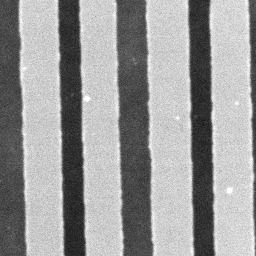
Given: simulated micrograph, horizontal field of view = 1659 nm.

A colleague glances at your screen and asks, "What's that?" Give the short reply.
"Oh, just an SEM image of lines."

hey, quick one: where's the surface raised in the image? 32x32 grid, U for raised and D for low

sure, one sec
DDDUUUUDDDUUUUDDDDUUUUUDDDUUUUUD
DDDUUUUDDDUUUUDDDDUUUUUDDDUUUUUD
DDDUUUUDDDUUUUDDDDUUUUUDDDUUUUUD
DDDUUUUDDDUUUUDDDDUUUUUUDDUUUUUD
DDDUUUUDDDUUUUDDDDUUUUUUDDUUUUUD
DDDUUUUDDDUUUUDDDDUUUUUUDDUUUUUD
DDDUUUUDDDUUUUUDDDDUUUUUDDUUUUUD
DDDUUUUDDDUUUUUDDDDUUUUUDDDUUUUD
DDDUUUUDDDUUUUUDDDDUUUUUDDDUUUUD
DDDUUUUDDDUUUUUDDDDUUUUUDDDUUUUD
DDDUUUUDDDUUUUUDDDDUUUUUDDDUUUUD
DDDUUUUDDDUUUUUDDDDUUUUUDDDUUUUD
DDDUUUUUDDUUUUUDDDDUUUUUDDDUUUUD
DDDUUUUUDDUUUUUDDDDUUUUUDDDUUUUD
DDDUUUUUDDUUUUUDDDDUUUUUDDDUUUUD
DDDUUUUUDDUUUUUDDDDUUUUUDDDUUUUD
DDDUUUUUDDUUUUUDDDDUUUUUDDDUUUUD
DDDUUUUUDDUUUUUDDDDUUUUUDDDUUUUD
DDDUUUUUDDUUUUUDDDDUUUUUDDDUUUUD
DDDUUUUUDDUUUUUDDDDUUUUUDDDUUUUU
DDDUUUUUDDUUUUUDDDDUUUUUDDDUUUUU
DDDUUUUUDDUUUUUDDDDUUUUUDDDUUUUU
DDDUUUUUDDDUUUUDDDDUUUUUDDDUUUUU
DDDUUUUUDDDUUUUDDDDUUUUUDDDUUUUU
DDDUUUUUDDDUUUUDDDDUUUUUDDDUUUUU
DDDUUUUUDDDUUUUDDDDUUUUUDDDUUUUU
DDDUUUUUDDDUUUUDDDDUUUUUDDDUUUUU
DDDUUUUUDDDUUUUDDDDUUUUUDDDUUUUU
DDDUUUUUDDDUUUUDDDDUUUUUDDDUUUUU
DDDUUUUUDDDUUUUDDDDUUUUUDDDUUUUU
DDDUUUUUDDDUUUUDDDDUUUUUDDDUUUUU
DDDUUUUUDDDUUUUDDDDUUUUUDDDUUUUU